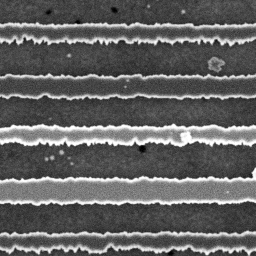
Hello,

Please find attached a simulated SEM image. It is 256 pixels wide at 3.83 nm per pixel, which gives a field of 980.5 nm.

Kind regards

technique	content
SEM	lines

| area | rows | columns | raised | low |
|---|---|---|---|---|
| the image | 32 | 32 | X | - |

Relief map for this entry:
--------------------------------
--------------------------------
--------------------------------
XXXXXXXXXXXXXXXXXXXXXXXXXXXXXXXX
XXXXXXXXXXXXXXXXXXXXXXXXXXXXXXXX
--------------------------------
--------------------------------
--------------------------------
--------------------------------
XXXX-XXX---X---XXX-XXXXXX-X---XX
XXXXXXXXXXXXXXXXXXXXXXXXXXXXXXXX
XXXXXXXXXXXXXXXXXXXXXXXXXXXXXXXX
--------------------------------
--------------------------------
--------------------------------
--------------------------------
XXXXXXXXXXXXXXXXXXXXXXXXXXXXXXXX
XXXXXXXXXXXXXXXXXXXXXXXXXXXXXXXX
--------------------------------
--------------------------------
--------------------------------
--------------------------------
-X-XXXXXXXXXXXXXXXXXXXXXXXXXXXXX
XXXXXXXXXXXXXXXXXXXXXXXXXXXXXXXX
XXXXXXXXXXXXXXXXXXXXXXXXXXXXXXXX
----X---------X-----------------
--------------------------------
--------------------------------
--------------------------------
XXXXXXXXXXXXXXXXXXXXXXXXXXXXXXXX
XXXXXXXXXXXXXXXXXXXXXXXXXXXXXXXX
----X------XX------------X------